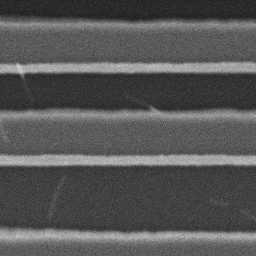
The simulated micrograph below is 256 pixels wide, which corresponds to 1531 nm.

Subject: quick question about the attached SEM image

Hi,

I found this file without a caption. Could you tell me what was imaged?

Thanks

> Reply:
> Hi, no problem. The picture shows lines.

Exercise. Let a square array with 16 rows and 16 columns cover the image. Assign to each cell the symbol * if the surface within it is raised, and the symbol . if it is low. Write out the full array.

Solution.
................
****************
****************
****************
*****.****..*...
................
................
****************
****************
****************
................
................
................
................
................
****************